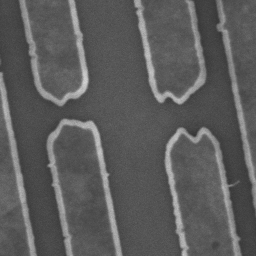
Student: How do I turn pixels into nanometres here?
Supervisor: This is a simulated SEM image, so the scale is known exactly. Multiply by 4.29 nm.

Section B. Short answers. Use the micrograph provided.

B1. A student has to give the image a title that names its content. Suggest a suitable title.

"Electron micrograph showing one or a few lines or trenches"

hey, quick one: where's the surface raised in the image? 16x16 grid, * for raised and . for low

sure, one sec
.****....***..**
..***....***..**
..***....***..**
..***....****.**
..***....****..*
...**.....**...*
...............*
*..............*
*..***.....**..*
*..***....****.*
*..***.....***..
*...***....***..
*...***....***..
**..***....***..
**..***....****.
**..***.....***.